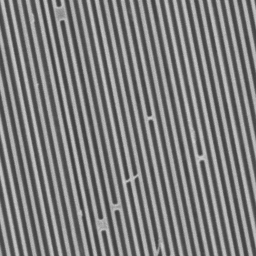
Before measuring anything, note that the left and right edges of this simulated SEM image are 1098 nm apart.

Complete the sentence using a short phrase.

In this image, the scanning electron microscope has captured parallel lines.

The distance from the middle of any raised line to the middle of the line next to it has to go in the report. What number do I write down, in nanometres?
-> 36.3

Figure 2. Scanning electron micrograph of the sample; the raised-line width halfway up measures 16.6 nm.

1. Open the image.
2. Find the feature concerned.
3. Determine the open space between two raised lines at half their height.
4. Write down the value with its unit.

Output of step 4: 0.0205 µm